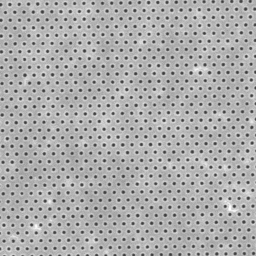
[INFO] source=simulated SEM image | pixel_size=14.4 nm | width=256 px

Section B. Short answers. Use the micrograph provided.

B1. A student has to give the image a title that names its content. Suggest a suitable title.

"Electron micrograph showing a regular array of holes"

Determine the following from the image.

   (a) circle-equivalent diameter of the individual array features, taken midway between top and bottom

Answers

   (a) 48.8 nanometers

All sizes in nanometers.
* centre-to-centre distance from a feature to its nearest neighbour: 128